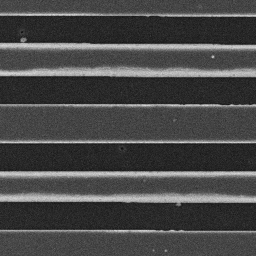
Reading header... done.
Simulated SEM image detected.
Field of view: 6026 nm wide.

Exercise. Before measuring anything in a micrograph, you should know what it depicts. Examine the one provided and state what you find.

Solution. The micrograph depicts lines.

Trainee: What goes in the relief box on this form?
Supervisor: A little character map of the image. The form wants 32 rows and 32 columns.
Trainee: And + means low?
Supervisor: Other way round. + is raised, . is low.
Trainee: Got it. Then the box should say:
++++++++++++++++++++++++++++++++
++++++++++++++++++++++++++++++++
................................
................................
................................
................................
++++++++++++++++++++++++++++++++
++++++++++++++++++++++++++++++++
++++++++++++++++++++++++++++++++
................................
................................
................................
................................
++++++++++++++++++++++++++++++++
++++++++++++++++++++++++++++++++
++++++++++++++++++++++++++++++++
++++++++++++++++++++++++++++++++
++++++++++++++++++++++++++++++++
................................
................................
................................
............................+++.
++++++++++++++++++++++++++++++++
++++++++++++++++++++++++++++++++
++++++++++++++++++++++++++++++++
................................
................................
................................
................................
++++++++++++++++++++++++++++++++
++++++++++++++++++++++++++++++++
++++++++++++++++++++++++++++++++